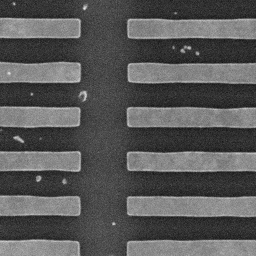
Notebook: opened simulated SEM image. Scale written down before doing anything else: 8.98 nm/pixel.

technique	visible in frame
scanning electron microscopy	groups of lines, slits or small figures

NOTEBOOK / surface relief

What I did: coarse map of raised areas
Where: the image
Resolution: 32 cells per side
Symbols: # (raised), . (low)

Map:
................................
................................
##########......#####........###
##########......################
##########......################
................................
................................
................................
##########......################
##########......################
................................
................................
................................
######..........##....##........
##########......################
##########......################
................................
................................
................................
##########......################
##########......################
................................
................................
................................
................................
##########......################
##########......################
................................
................................
................................
##########......################
##########......################